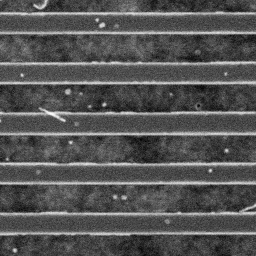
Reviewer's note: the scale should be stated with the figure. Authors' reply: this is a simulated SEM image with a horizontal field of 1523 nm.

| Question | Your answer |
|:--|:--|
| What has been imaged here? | lines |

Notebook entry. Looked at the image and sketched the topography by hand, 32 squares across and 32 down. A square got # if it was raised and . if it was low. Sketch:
................................
................................
################################
################################
................................
................................
................................
................................
################################
################################
................................
................................
................................
................................
################################
################################
################################
................................
................................
................................
#######..###...#........#.######
################################
################################
................................
................................
................................
................................
################################
################################
................................
................................
................................